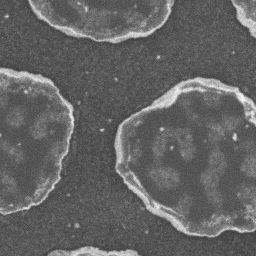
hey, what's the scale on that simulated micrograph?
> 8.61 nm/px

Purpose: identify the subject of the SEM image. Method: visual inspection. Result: raised bodies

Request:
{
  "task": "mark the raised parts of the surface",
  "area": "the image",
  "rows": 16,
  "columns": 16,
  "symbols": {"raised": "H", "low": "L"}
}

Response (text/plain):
LLHHHHHHHHHLLLLH
LLLHHHHHHHLLLLLH
LLLLLLHLLLLLLLLL
LLLLLLLLLLLLLLLL
HLLLLLLLLLLLLLLL
HHHLLLLLLLLHHHLL
HHHHLLLLLLHHHHHH
HHHHHLLLHHHHHHHH
HHHHLLLHHHHHHHHH
HHHHLLLHHHHHHHHH
HHHHLLLHHHHHHHHH
HHHLLLLLHHHHHHHH
HHHLLLLLLHHHHHHH
LLLLLLLLLLHHHHHH
LLLLLLLLLLLLHHLL
LLLLLLLLLLLLLLLL